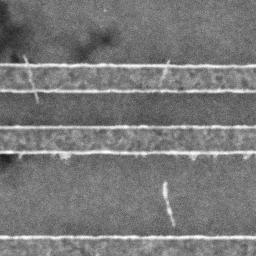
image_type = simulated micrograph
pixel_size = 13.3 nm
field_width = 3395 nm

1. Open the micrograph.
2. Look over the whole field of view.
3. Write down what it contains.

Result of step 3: lines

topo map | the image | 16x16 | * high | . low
................
................
................
................
****************
****************
................
................
****************
****************
................
................
................
................
................
****************